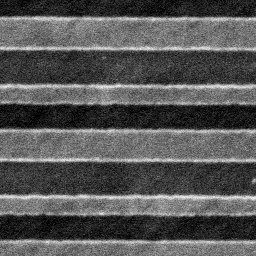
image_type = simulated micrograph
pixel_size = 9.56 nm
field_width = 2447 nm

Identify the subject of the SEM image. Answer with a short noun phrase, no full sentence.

lines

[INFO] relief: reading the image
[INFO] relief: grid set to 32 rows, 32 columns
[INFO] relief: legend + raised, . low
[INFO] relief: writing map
................................
................................
++++++++++++++++++++++++++++++++
++++++++++++++++++++++++++++++++
++++++++++++++++++++++++++++++++
++++++++++++++++++++++++++++++++
................................
................................
................................
................................
................................
++++++++++++++++++++++++++++++++
++++++++++++++++++++++++++++++++
................................
................................
................................
++++++++++++++++++++++++++++++++
++++++++++++++++++++++++++++++++
++++++++++++++++++++++++++++++++
++++++++++++++++++++++++++++++++
................................
................................
................................
................................
................................
++++++++++++++++++++++++++++++++
++++++++++++++++++++++++++++++++
................................
................................
................................
++++++++++++++++++++++++++++++++
++++++++++++++++++++++++++++++++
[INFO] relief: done